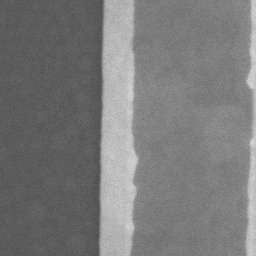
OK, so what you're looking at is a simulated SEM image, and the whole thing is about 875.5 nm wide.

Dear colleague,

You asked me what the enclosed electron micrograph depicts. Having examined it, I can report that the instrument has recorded one or a few lines or trenches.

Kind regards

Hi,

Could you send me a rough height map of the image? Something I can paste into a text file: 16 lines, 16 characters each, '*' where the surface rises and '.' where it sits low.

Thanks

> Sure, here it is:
.......*********
.......*********
.......*********
.......*********
.......*********
.......*********
.......*********
.......*********
.......*********
.......*********
.......*********
.......*********
.......*********
.......*********
.......*********
.......*********